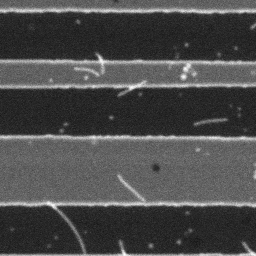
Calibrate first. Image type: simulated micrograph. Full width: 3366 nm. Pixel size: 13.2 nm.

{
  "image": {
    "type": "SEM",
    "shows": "lines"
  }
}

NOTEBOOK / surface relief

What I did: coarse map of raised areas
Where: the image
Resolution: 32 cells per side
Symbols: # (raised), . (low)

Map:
################################
.........................###....
................................
................................
................................
................................
................................
............#...................
################################
################################
################################
................................
................................
................................
................................
................................
................................
################################
################################
################################
################################
################################
################################
################################
################################
################################
................................
................................
................................
................................
................................
................................